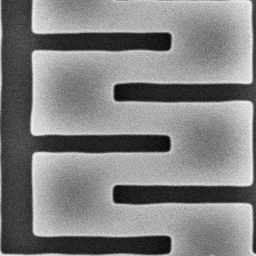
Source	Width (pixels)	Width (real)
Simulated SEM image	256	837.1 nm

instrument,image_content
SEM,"groups of lines, slits or small figures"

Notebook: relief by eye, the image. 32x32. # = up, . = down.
....###########################.
....###########################.
....###########################.
....###########################.
.....................###########
.....................###########
....###########################.
....###########################.
....###########################.
....###########################.
....###########.................
....##########..................
....##########..................
....############################
....############################
....###########################.
....###########################.
.....................##########.
.....................##########.
....############################
....############################
....############################
....############################
....##########..................
....##########..................
....###########....############.
....############################
....############################
....############################
.....................###########
.....................##########.
.....................###########